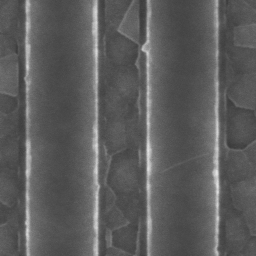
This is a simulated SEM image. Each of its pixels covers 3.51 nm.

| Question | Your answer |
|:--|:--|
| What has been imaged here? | one or a few lines or trenches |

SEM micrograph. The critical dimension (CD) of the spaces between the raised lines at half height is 175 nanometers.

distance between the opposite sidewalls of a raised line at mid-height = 249 nanometres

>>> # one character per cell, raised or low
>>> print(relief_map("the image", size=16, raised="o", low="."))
..oooo...ooooo..
..oooo...ooooo..
..oooo...ooooo..
..oooo...ooooo..
..oooo...ooooo..
..oooo...ooooo..
..oooo...ooooo..
..oooo...ooooo..
..oooo...ooooo..
..oooo...ooooo..
..oooo...ooooo..
..oooo...ooooo..
..oooo...ooooo..
..oooo...ooooo..
..oooo...ooooo..
..oooo...ooooo..